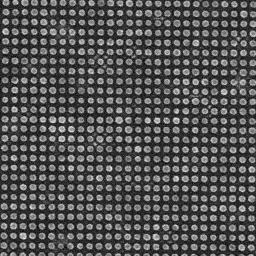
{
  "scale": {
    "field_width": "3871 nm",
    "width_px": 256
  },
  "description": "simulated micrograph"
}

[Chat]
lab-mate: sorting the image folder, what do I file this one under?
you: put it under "a regular array of raised bodies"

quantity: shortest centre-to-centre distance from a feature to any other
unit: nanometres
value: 139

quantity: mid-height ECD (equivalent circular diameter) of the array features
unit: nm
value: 88.7